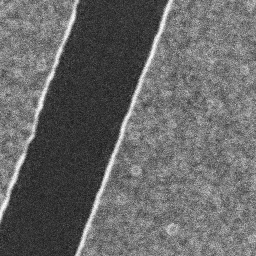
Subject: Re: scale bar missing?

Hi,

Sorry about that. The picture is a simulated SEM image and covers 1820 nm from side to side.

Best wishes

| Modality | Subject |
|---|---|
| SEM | one or a few lines or trenches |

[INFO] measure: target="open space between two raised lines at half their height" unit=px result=85.6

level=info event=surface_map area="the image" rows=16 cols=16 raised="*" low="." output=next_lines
*****.....******
****......******
****......******
****.....*******
***......*******
***......*******
***.....********
**......********
**......********
**.....*********
*......*********
*.....**********
......**********
......**********
.....***********
.....***********